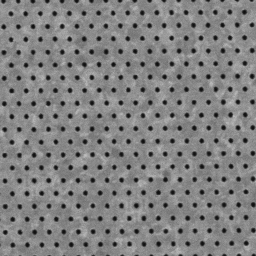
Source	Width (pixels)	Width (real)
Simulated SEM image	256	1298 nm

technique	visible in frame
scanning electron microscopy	a regular array of holes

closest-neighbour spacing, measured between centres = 0.0722 um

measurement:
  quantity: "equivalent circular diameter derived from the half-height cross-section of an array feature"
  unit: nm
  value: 25.6